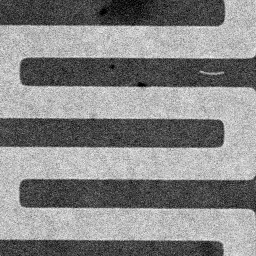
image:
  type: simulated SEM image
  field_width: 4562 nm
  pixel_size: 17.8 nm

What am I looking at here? groups of lines, slits or small figures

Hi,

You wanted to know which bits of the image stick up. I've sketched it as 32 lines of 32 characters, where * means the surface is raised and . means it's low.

............................****
............................****
............................****
********************************
********************************
********************************
********************************
***.............................
**..............................
**..............................
***.............................
********************************
********************************
********************************
********************************
............................****
............................****
............................****
*******....................*****
********************************
********************************
********************************
***.............................
**..............................
**..............................
**..............................
********************************
********************************
********************************
********************************
............................****
............................****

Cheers